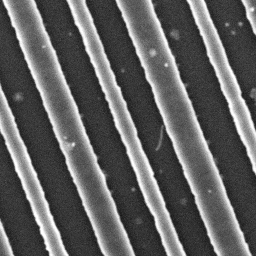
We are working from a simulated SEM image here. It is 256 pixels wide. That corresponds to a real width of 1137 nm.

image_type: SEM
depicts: lines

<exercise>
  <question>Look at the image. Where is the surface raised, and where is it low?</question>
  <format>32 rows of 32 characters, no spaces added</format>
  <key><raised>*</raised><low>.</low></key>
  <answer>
.***.....**....****.....**....**
.****....**....****.....**.....*
.****....**.....****....**.....*
..****....**....****.....**.....
..****....**....*****....**.....
...***.....**....****.....**....
...****....**....****.....**....
...****....**.....****....**....
....****....**....****.....**...
....****....**....****.....**...
....****.....**....****.....**..
.....****....**....****.....**..
*....****....**....*****....**..
*.....****....**....****.....**.
**....****....**....****.....**.
**....****....***....****....***
**.....****....**....****.....**
.**....****....**....*****....**
.**.....***.....**....****.....*
.***....****....**....****.....*
..**....****.....**....****.....
..**.....****....**....****.....
...**....****....**....*****....
...**.....***.....**....****....
...***....****....**....****....
....**....****....***....****...
....**.....****....**....****...
.....**....****....**....*****..
.....**.....***.....**....****..
*....***....****....**....****..
*.....**....****....***....****.
**....**.....****....**....****.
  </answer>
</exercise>